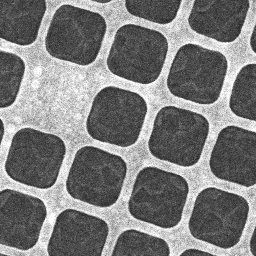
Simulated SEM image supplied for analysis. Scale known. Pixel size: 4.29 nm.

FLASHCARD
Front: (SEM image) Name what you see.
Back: a regular array of holes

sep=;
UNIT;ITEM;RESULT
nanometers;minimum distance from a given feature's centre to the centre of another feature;274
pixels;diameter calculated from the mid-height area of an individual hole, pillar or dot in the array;60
